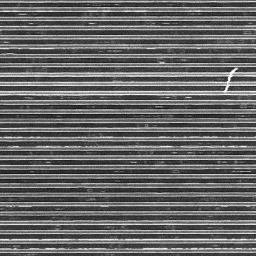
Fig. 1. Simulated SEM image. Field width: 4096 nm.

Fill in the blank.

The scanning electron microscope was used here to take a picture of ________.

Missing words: parallel lines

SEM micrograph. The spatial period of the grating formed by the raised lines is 148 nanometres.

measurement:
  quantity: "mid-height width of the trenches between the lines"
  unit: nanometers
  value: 90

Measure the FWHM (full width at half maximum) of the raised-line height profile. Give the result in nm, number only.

60